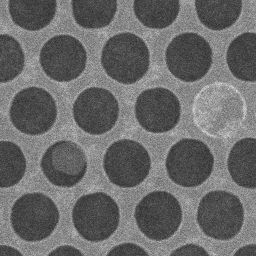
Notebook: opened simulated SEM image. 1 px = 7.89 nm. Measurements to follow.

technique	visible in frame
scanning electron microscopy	a regular array of holes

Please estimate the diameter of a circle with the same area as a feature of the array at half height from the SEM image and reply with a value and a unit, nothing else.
48.4 pixels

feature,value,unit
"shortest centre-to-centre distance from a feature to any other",0.48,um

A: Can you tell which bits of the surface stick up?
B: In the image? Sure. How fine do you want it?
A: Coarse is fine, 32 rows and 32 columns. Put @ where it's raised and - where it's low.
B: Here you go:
@------@@------@@-----@@------@@
@------@@------@@-----@@@-----@@
@------@@-----@@@-----@@@-----@@
@@@--@@@@@---@@@@@@-@@@@@@--@@@@
-@@@@@@--@@@@@---@@@@@---@@@@@--
--@@@@----@@@-----@@@-----@@@---
---@@------@@------@@------@----
---@@------@@------@@------@----
---@@------@@------@@-----@@@---
--@@@@----@@@@----@@@@---@@@@---
@@@@@@@@@@@@@@@@@@@@@@@@@@@@@@@@
@@----@@@@----@@@@---@@@@@@@@@@@
@@-----@@------@@-----@@@@@@@@@@
@------@@------@@------@@@@@@@@@
@------@@------@@-----@@@@@@@@@@
@@-----@@@----@@@-----@@@@@@@@@@
@@@---@@@@@--@@@@@@--@@@@@@@@@@@
@@@@@@@@@@@@@@@-@@@@@@@--@@@@@--
--@@@@----@@@-----@@@-----@@@---
---@@------@@------@@------@@---
---@@------@@------@@------@----
---@@------@@------@@------@@---
---@@@----@@@@----@@@-----@@@---
@@@@@@@@@@@@@@@@@@@@@@@@@@@@@@@-
@@@---@@@@----@@@@----@@@@----@@
@@-----@@------@@-----@@@-----@@
@------@@------@@------@@------@
@------@@------@@------@@-----@@
@@-----@@------@@-----@@@-----@@
@@----@@@@----@@@@---@@@@@---@@@
@@@@@@@@@@@@@@@--@@@@@@@@@@@@@@@
--@@@@----@@@@----@@@@----@@@---